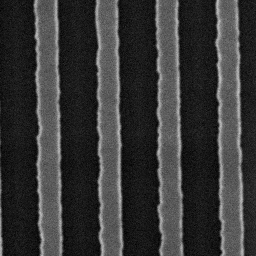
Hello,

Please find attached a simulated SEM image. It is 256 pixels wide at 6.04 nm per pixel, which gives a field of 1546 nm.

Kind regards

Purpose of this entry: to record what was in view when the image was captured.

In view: lines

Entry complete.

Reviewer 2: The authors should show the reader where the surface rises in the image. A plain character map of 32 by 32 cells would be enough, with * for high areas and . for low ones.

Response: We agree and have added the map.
....***.....***.....**.....***..
....***.....***.....**.....***..
....***.....***....***.....***..
....***.....***.....**.....***..
....***.....***.....**.....***..
.....**.....***.....**.....***..
.....**.....***.....**.....***..
.....**.....***.....**.....***..
.....**.....***.....**.....***..
.....**.....***.....**.....***..
.....**.....***.....**.....***..
.....**.....***.....**.....***..
.....**.....***.....**.....***..
.....**.....***.....**.....***..
.....**.....***.....**.....***..
.....**.....***.....**.....***..
.....**.....***.....**.....***..
.....***....***.....***....***..
.....***....***.....***....***..
.....***....***.....**.....***..
.....**......**.....**.....***..
.....***.....**.....***.....**..
.....***....***.....***....***..
.....***....***.....***....***..
.....***....***.....***....***..
.....***.....**.....***.....**..
.....***.....**.....***....***..
.....***....***.....***.....**..
.....***.....**.....***.....**..
.....***....***.....***.....**..
.....***.....**.....***.....**..
.....***.....**.....***.....**..